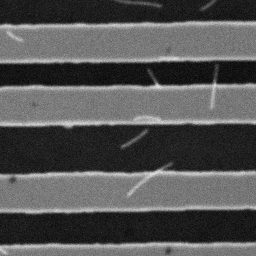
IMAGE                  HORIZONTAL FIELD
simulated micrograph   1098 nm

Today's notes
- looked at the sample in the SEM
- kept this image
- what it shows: lines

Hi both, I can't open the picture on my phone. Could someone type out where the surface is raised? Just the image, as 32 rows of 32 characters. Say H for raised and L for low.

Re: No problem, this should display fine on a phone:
LLLLLLLLLLLLLLLLLLLLLLLLLLLLLLLL
LLLLLLLLLLLLLLLLLLLLLLLLLLLLLLLL
LLLLLLLLLLLLLLLLLLLLLLLLLLLLLLLL
HHHHHHHHHHHHHHHHHHHHHHHHHHHHHHHH
HHHHHHHHHHHHHHHHHHHHHHHHHHHHHHHH
HHHHHHHHHHHHHHHHHHHHHHHHHHHHHHHH
HHHHHHHHHHHHHHHHHHHHHHHHHHHHHHHH
HHHHHHHHHHHHHHHHHHHHHHHHHHHLLLLL
LLLLLLLLLLLLLLLLLLLLLLLLLLLLLLLL
LLLLLLLLLLLLLLLLLLLLLLLLLLLLLLLL
LLLLLLLLLLLLLLLLLLLLLLLLLLHLLLLL
HHHHHHHHHHHHHHHHHHHHHHHHHHHHHHHH
HHHHHHHHHHHHHHHHHHHHHHHHHHHHHHHH
HHHHHHHHHHHHHHHHHHHHHHHHHHHHHHHH
HHHHHHHHHHHHHHHHHHHHHHHHHHHHHHHH
HHHHHHHHHHHHHHLLLLLLLLLLLLLLLLLL
LLLLLLLLLLLLLLLLLLLLLLLLLLLLLLLL
LLLLLLLLLLLLLLLLLLLLLLLLLLLLLLLL
LLLLLLLLLLLLLLLLLLLLLLLLLLLLLLLL
LLLLLLLLLLLLLLLLLLLLLLLLLLLLLLLL
LLLLLLLLLLLLLLLLLLLLLLLLLLLLLLLL
LLLLLLLLLLLLLLLLLLLHHHLLLLLLLLHH
HHHHHHHHHHHHHHHHHHHHHHHHHHHHHHHH
HHHHHHHHHHHHHHHHHHHHHHHHHHHHHHHH
HHHHHHHHHHHHHHHHHHHHHHHHHHHHHHHH
HHHHHHHHHHHHHHHHHHHHHHHHHHHHHHHH
LLLHHHLLHLLLLLLLLLLLLLLLLLLLLLLL
LLLLLLLLLLLLLLLLLLLLLLLLLLLLLLLL
LLLLLLLLLLLLLLLLLLLLLLLLLLLLLLLL
LLLLLLLLLLLLLLLLLLLLLLLLLLLLLLLL
LLLLLLLLLLLLLLLLLLHHHHHHLLHHHHHH
HHHHHHHHHHHHHHHHHHHHHHHHHHHHHHHH